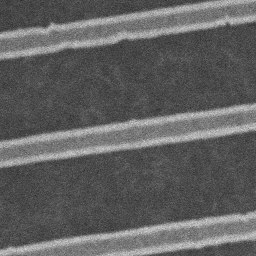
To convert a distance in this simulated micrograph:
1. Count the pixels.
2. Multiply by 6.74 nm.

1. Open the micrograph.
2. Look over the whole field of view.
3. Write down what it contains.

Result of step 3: one or a few lines or trenches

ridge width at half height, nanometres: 145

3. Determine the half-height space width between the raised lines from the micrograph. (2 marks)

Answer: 86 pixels